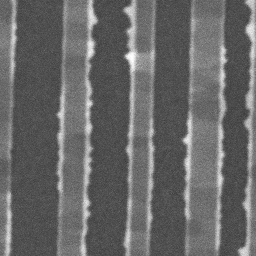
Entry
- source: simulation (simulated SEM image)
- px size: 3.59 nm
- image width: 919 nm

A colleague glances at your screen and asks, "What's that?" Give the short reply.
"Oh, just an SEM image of one or a few lines or trenches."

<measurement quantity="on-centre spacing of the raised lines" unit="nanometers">234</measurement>